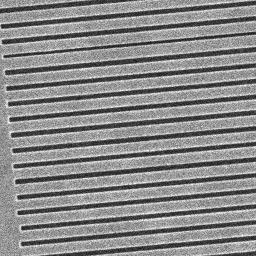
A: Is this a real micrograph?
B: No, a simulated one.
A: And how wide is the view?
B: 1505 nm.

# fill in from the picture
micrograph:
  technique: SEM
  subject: parallel lines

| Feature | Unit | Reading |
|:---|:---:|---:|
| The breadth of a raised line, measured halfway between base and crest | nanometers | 60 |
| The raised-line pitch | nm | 91.8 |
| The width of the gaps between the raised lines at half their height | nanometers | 30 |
